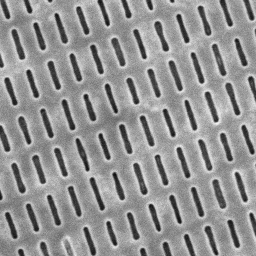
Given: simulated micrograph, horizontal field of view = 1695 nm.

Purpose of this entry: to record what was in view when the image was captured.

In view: a regular array of holes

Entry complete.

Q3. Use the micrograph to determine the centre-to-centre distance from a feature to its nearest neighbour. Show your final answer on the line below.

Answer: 151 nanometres